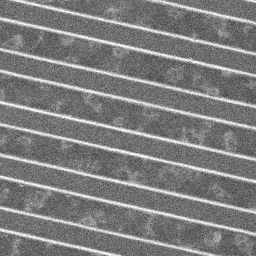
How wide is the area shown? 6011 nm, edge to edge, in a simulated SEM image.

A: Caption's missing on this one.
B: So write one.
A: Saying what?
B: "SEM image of parallel lines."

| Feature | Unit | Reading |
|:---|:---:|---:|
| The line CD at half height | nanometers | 492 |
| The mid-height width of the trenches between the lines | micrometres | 0.704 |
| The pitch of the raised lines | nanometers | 1210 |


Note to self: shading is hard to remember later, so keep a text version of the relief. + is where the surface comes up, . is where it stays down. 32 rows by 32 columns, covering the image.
++++.................+++++++++++
++++++++..................++++++
.++++++++++++.................++
.....++++++++++++...............
..........++++++++++++..........
..............++++++++++++......
++.................++++++++++++.
++++++.................+++++++++
+++++++++++.................++++
...++++++++++++.................
.......++++++++++++.............
...........+++++++++++++........
................++++++++++++....
+++.................++++++++++++
++++++++.................+++++++
++++++++++++.................+++
....++++++++++++................
.........++++++++++++...........
.............++++++++++++.......
+.................++++++++++++..
+++++.................++++++++++
++++++++++.................+++++
..++++++++++++.................+
......+++++++++++++.............
...........++++++++++++.........
...............++++++++++++.....
++.................+++++++++++++
+++++++.................++++++++
+++++++++++.................++++
....++++++++++++................
........++++++++++++............
.............+++++++++++........